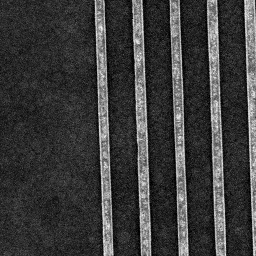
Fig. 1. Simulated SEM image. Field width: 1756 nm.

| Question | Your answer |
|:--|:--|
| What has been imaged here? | parallel lines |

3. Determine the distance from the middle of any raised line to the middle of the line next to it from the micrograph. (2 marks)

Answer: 37.4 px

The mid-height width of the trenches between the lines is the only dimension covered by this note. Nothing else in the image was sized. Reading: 191 nanometers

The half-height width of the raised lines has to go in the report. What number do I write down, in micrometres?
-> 0.0634